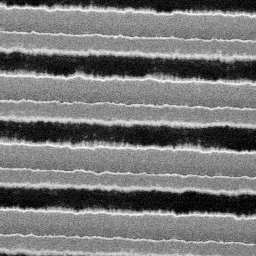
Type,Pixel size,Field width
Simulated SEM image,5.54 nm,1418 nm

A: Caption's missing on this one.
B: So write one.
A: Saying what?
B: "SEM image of lines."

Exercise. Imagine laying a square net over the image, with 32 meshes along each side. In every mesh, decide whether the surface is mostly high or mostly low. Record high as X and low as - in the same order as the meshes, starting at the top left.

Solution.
--------------------------------
XXXXXXXXXXXXXXXXX---------------
XXXXXXXXXXXXXXXXXXXXXXXXXXXXXXXX
XXXXXXXXXXXXXXXXXXXXXXXXXXXXXXXX
XXXXXXXXXXXXXXXXXXXXXXXXXXXXXXXX
XXXXXXXXXXXXXXXXXXXXXXXXXXXXXXXX
---------XX--XXXXXXXXXXXXXXXXXXX
--------------------------------
--------------------------------
XXX-----------------------------
XXXXXXXXXXXXXXXXXXXXXXXXXXXXX-XX
XXXXXXXXXXXXXXXXXXXXXXXXXXXXXXXX
XXXXXXXXXXXXXXXXXXXXXXXXXXXXXXXX
XXXXXXXXXXXXXXXXXXXXXXXXXXXXXXXX
XXXXXXXXXXXXXXXXXXXXXXXXXXXXXXXX
-----------------------XXX-XXXXX
--------------------------------
--------------------------------
XXXXXXXXXXXXXXXX----------------
XXXXXXXXXXXXXXXXXXXXXXXXXXXXXXXX
XXXXXXXXXXXXXXXXXXXXXXXXXXXXXXXX
XXXXXXXXXXXXXXXXXXXXXXXXXXXXXXXX
XXXXXXXXXXXXXXXXXXXXXXXXXXXXXXXX
---------------XXXXXXXXXXXXXXXXX
--------------------------------
--------------------------------
XXXXXXXXX---X-------------------
XXXXXXXXXXXXXXXXXXXXXXXXXXXXXXXX
XXXXXXXXXXXXXXXXXXXXXXXXXXXXXXXX
XXXXXXXXXXXXXXXXXXXXXXXXXXXXXXXX
XXXXXXXXXXXXXXXXXXXXXXXXXXXXXXXX
---XXXXXXXXXXXXXXXXXXXXXXXXXXXXX